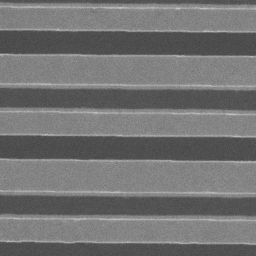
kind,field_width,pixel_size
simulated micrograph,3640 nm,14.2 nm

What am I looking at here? lines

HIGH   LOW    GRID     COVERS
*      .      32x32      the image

................................
********************************
********************************
********************************
................................
................................
................................
********************************
********************************
********************************
********************************
................................
................................
................................
********************************
********************************
********************************
................................
................................
................................
********************************
********************************
********************************
********************************
................................
................................
................................
********************************
********************************
********************************
................................
................................